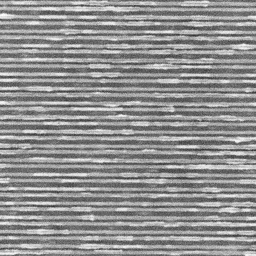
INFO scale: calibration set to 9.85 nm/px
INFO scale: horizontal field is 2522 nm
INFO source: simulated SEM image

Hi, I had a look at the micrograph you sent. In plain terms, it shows parallel lines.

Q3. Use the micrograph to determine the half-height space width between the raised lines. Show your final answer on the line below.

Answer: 3.88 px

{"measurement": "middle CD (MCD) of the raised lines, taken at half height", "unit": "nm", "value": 28.3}